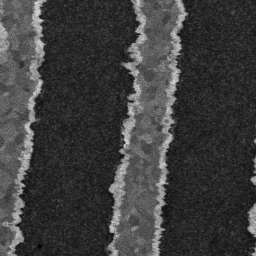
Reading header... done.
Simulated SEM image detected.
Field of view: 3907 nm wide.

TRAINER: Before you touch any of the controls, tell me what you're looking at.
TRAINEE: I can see one or a few lines or trenches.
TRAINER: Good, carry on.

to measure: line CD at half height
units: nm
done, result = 596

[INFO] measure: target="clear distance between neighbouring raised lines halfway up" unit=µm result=1.5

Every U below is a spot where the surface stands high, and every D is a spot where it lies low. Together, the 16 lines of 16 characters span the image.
UUDDDDDDDUUDDDDD
UUDDDDDDDUUDDDDD
UUDDDDDDDUUDDDDD
UUUDDDDDDUUDDDDD
UUDDDDDDUUUDDDDD
UUDDDDDDDUUDDDDD
UUDDDDDDUUUDDDDD
UUDDDDDDUUUDDDDD
UUDDDDDDUUUDDDDD
UUDDDDDDUUDDDDDD
UDDDDDDDUUDDDDDD
UDDDDDDUUUDDDDDD
UDDDDDDUUUDDDDDD
UDDDDDDUUUDDDDDD
UDDDDDDUUUDDDDDD
UDDDDDDUUUDDDDDD